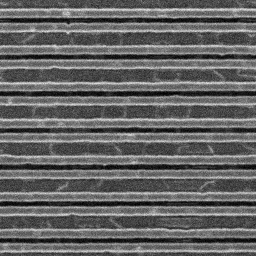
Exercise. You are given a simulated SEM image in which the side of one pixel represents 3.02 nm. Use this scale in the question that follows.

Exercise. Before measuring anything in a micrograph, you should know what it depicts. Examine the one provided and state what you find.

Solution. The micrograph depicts parallel lines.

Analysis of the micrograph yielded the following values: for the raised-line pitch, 54.5 nm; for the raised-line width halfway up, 26.5 nm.